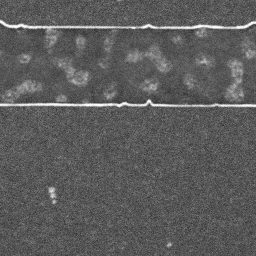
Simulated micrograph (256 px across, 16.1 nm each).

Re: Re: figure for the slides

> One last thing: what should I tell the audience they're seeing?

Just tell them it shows one or a few lines or trenches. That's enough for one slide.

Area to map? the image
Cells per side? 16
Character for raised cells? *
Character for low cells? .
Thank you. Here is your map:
****************
****************
................
................
................
................
.........*......
****************
****************
****************
****************
****************
****************
****************
****************
****************